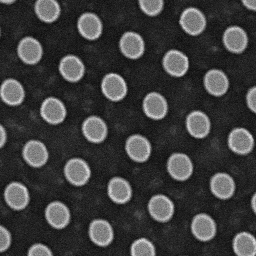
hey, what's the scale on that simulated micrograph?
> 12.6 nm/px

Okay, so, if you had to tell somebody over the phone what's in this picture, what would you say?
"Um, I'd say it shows a regular array of raised bodies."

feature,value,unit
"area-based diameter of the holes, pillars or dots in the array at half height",314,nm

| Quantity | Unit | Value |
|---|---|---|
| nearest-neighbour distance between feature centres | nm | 572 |